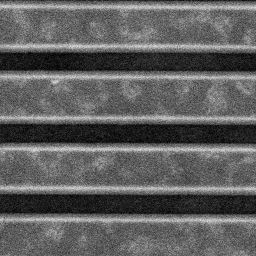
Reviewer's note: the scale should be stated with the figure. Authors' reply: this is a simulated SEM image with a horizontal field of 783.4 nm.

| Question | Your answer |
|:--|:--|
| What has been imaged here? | one or a few lines or trenches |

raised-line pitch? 218 nanometres